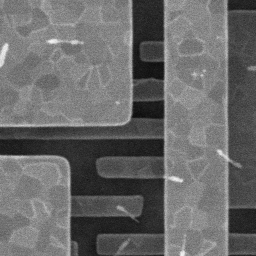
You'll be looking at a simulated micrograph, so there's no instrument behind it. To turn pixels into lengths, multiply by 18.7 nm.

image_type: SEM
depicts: wiring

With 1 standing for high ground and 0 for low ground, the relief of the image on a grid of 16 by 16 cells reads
1111111100111100
1111111100111100
1111111100111100
1111111100111100
1111111100111100
1111111100111100
1111111100111100
1111111100111100
0000000000111100
0000000000111100
1111000000111100
1111000000111100
1111000000111100
1111000000111100
1111000000111100
1111000000111100